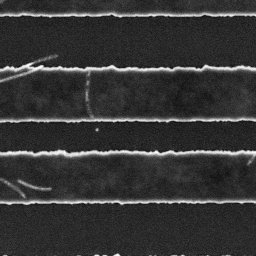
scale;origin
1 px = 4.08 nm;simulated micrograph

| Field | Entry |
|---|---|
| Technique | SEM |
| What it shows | lines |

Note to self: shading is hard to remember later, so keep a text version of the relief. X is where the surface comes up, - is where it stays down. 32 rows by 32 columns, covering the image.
XXXXXXXXXXXXXXXXXXXXXXXXXXXXXXXX
XXXXXXXXXXXXXXXXXXXXXXXXXXXXXXXX
--------------------------------
--------------------------------
--------------------------------
--------------------------------
--------------------------------
--------------------------------
XXXXXXXX-X-XXXX-X---X-XXXXXXXXXX
XXXXXXXXXXXXXXXXXXXXXXXXXXXXXXXX
XXXXXXXXXXXXXXXXXXXXXXXXXXXXXXXX
XXXXXXXXXXXXXXXXXXXXXXXXXXXXXXXX
XXXXXXXXXXXXXXXXXXXXXXXXXXXXXXXX
XXXXXXXXXXXXXXXXXXXXXXXXXXXXXXXX
XXXXXXXXXXXXXXXXXXXXXXXXXXXXXXXX
--------------------------------
--------------------------------
--------------------------------
--------------------------------
XXXXXXXXXXXXXXXXXXXXXXXXXXXXXXXX
XXXXXXXXXXXXXXXXXXXXXXXXXXXXXXXX
XXXXXXXXXXXXXXXXXXXXXXXXXXXXXXXX
XXXXXXXXXXXXXXXXXXXXXXXXXXXXXXXX
XXXXXXXXXXXXXXXXXXXXXXXXXXXXXXXX
XXXXXXXXXXXXXXXXXXXXXXXXXXXXXXXX
--------------------------------
--------------------------------
--------------------------------
--------------------------------
--------------------------------
--------------------------------
--------------------------------